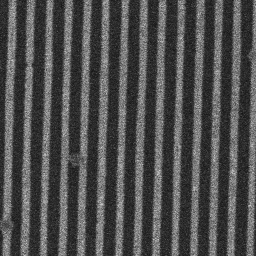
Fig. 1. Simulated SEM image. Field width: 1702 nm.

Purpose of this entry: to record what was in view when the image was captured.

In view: parallel lines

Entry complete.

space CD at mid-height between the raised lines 76.5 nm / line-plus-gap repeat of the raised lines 125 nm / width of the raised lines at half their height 46.6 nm